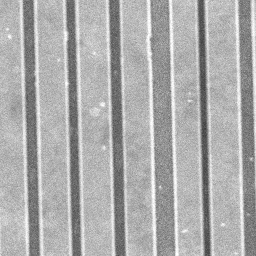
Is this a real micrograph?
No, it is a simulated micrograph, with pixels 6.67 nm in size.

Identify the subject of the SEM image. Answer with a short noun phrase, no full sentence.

parallel lines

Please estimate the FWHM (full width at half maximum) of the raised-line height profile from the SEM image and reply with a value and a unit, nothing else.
0.201 micrometres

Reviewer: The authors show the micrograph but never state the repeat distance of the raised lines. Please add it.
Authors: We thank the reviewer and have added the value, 286 nanometers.